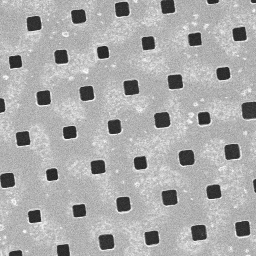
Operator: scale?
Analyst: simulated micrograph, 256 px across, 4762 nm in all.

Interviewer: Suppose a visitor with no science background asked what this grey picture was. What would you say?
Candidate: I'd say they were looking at a regular array of holes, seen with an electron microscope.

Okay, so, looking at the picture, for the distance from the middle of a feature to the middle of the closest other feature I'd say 0.793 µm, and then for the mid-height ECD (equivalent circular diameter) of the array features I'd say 288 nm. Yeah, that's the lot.